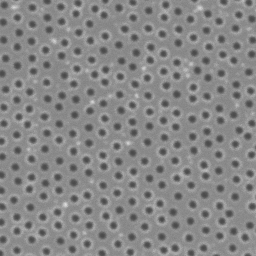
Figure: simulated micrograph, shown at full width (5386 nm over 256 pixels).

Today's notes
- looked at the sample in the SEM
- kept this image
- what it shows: a regular array of holes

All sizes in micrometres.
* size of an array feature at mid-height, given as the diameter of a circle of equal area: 0.182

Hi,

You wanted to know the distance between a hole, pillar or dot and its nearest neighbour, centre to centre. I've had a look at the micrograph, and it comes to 294 nm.